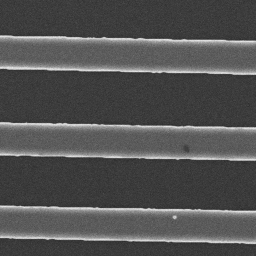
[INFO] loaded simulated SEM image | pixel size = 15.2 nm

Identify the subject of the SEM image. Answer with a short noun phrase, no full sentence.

lines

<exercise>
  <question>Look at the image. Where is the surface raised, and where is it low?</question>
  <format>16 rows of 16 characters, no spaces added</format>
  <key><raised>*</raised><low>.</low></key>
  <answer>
................
................
***********.....
****************
..........******
................
................
................
****************
****************
................
................
................
****************
****************
................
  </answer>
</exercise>